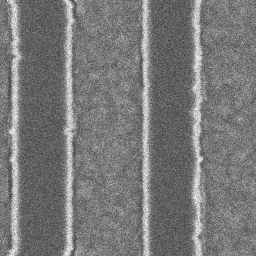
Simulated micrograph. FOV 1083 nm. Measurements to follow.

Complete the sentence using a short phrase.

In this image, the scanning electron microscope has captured one or a few lines or trenches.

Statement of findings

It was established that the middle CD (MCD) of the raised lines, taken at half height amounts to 233 nanometers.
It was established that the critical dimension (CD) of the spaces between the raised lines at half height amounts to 316 nm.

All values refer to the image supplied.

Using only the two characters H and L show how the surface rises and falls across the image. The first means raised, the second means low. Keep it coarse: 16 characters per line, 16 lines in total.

LHHHLLLLLHHHLLLL
LHHHLLLLLHHHLLLL
LHHHLLLLLHHHLLLL
LHHHLLLLLHHHLLLL
LHHHLLLLLHHHLLLL
LHHHLLLLLHHHLLLL
LHHHLLLLLHHHLLLL
LHHHLLLLLHHHLLLL
LHHHLLLLLHHHLLLL
LHHHLLLLLHHHLLLL
LHHHLLLLLHHHLLLL
LHHHLLLLLHHHLLLL
LHHHLLLLLHHHLLLL
LHHHLLLLLHHHLLLL
LHHHLLLLLHHHLLLL
LHHHLLLLLHHHLLLL